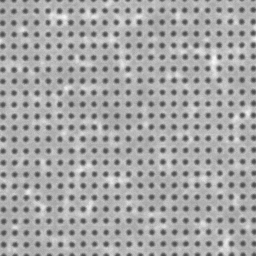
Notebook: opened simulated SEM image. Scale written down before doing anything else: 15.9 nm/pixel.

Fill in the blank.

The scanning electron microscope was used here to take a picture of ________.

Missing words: a regular array of holes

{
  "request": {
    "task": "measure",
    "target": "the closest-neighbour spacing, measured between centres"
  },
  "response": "0.178 microns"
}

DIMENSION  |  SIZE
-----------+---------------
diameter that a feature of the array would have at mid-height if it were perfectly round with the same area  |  106 nm